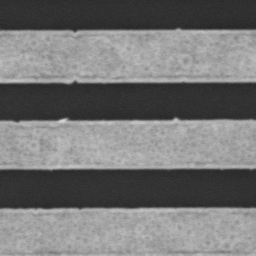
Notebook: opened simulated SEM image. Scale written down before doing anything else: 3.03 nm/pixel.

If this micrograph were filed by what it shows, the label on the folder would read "one or a few lines or trenches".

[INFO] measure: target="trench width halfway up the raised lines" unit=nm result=124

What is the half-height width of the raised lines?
47.5 px